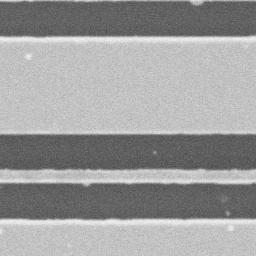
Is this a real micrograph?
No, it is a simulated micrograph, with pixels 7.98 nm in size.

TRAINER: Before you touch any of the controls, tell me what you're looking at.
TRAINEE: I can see lines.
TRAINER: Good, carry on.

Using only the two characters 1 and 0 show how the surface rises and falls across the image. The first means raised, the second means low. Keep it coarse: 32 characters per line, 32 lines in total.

00000000000000000000000000000000
00000000000000000000000000000000
00000000000000000000000000000000
00000000000000000000000000000000
00000000000000000000000000000000
11111111111111111111111111111111
11111111111111111111111111111111
11111111111111111111111111111111
11111111111111111111111111111111
11111111111111111111111111111111
11111111111111111111111111111111
11111111111111111111111111111111
11111111111111111111111111111111
11111111111111111111111111111111
11111111111111111111111111111111
11111111111111111111111111111111
11111111111111111111111111111111
00000000000000000000000000000000
00000000000000000000000000000000
00000000000000000000000000000000
00000000000000000000000000000000
11111111111111111111111111111111
11111111111111111111111111111111
00000000000000000000000000000000
00000000000000000000000000000000
00000000000000000000000000000000
00000000000000000000000000000000
00000000000000000001100001111111
11111111111111111111111111111111
11111111111111111111111111111111
11111111111111111111111111111111
11111111111111111111111111111111